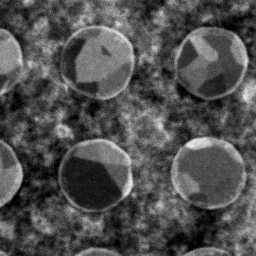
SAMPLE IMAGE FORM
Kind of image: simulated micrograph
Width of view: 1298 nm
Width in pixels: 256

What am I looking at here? raised bodies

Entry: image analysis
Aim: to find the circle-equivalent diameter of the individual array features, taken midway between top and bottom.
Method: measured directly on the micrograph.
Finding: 72.4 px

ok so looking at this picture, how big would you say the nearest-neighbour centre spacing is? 0.568 µm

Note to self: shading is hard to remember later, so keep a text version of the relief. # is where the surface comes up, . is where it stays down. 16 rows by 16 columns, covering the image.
................
................
#...####....###.
#...####...####.
#...####...####.
#....###....###.
................
................
................
#...####...####.
#...####...####.
#...####...####.
#...####....###.
................
................
................